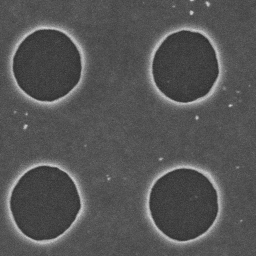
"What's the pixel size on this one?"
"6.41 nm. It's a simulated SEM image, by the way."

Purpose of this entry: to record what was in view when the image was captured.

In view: holes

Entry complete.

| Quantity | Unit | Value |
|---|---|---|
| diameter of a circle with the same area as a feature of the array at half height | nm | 457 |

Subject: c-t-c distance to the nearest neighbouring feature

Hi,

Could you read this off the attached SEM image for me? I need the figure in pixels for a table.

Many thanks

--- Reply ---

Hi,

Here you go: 138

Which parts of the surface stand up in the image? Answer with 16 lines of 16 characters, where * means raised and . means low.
****************
****************
*...******...***
*....*****....**
*....****.....**
*....*****...***
****************
****************
****************
****************
**..************
*....*****...***
*....****.....**
*....****.....**
*...******...***
****************